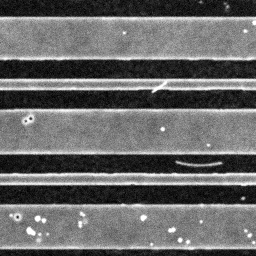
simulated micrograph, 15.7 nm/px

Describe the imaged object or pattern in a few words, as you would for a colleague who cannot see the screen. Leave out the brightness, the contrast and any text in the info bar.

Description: lines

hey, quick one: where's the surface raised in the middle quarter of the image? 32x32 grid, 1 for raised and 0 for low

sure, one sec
00000000000000000000000000000000
00000000000000000000000000000000
00000000000000000000000000000000
00000000000000000000000000000000
11111111111111111111111111111111
11111111111111111111111111111111
00000000000000000000000000000000
00000000000000000000000000000000
00000000000000000000000000000000
00000000000000000000000000000000
00000000000000000000000000000000
00000011111000011111110011111111
11111111111111111111111111111111
11111111111111111111111111111111
11111111111111111111111111111111
11111111111111111111111111111111
11111111111111111111111111111111
11111111111111111111111111111111
11111111111111111111111111111111
11111111111111111111111111111111
11111111111111111111111111111111
11111111111111111111111111111111
00000000000000000000000000000000
00000000000000000000000000000000
00000000000000000000000000000000
00000000000000000000000000000000
00000000000000000000000000000000
11111111011001111111101010010000
11111111111111111111111111111111
11111111111111111111111111111111
00000000000000000000000000000000
00000000000000000000000000000000